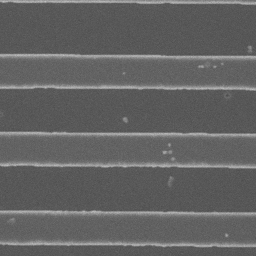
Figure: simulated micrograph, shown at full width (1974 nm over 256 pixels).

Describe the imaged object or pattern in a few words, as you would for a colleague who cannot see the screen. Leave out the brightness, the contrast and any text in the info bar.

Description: lines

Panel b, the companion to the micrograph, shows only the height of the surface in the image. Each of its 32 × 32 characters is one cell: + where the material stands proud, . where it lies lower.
................................
................................
................................
................................
................................
................................
................................
++++++++++++++++++++++++++++++++
++++++++++++++++++++++++++++++++
++++++++++++++++++++++++++++++++
++++++++++++++++++++++++++++++++
................................
................................
................................
................................
................................
................................
++++++++++++++++++++++++++++++++
++++++++++++++++++++++++++++++++
++++++++++++++++++++++++++++++++
++++++++++++++++++++++++++++++++
................................
................................
................................
................................
................................
++.+++..........................
++++++++++++++++++++++++++++++++
++++++++++++++++++++++++++++++++
++++++++++++++++++++++++++++++++
..+++.++++++.+++++++++++++++++++
................................